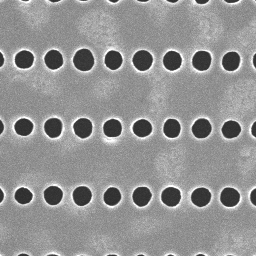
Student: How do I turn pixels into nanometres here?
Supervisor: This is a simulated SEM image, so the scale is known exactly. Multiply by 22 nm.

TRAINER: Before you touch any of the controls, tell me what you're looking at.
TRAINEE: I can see a regular array of holes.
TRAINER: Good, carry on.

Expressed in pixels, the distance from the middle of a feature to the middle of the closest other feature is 29.4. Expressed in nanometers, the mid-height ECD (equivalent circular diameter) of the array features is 431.